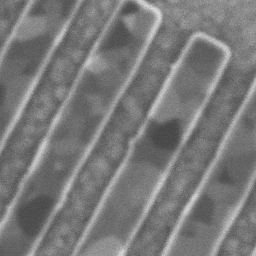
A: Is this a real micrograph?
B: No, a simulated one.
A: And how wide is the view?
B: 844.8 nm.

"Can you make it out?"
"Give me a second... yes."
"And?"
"one or a few lines or trenches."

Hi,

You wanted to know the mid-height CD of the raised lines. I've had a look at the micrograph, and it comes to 0.144 microns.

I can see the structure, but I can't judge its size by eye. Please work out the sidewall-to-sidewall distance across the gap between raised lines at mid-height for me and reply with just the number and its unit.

116 nm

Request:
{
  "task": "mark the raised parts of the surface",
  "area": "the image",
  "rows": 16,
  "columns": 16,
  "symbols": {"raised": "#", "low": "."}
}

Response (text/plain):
..###..###......
.###...###......
.###..###...#...
###...###..###..
###..###...###..
##...###..###...
##..###...###..#
#..####..###...#
...###...###..##
..####..###...##
..###...###..###
.###...###...###
.###..####..###.
###...###..####.
###..###...###..
##...###..####..